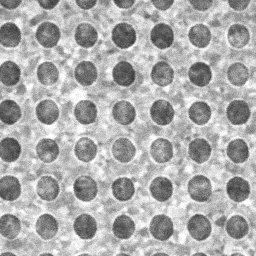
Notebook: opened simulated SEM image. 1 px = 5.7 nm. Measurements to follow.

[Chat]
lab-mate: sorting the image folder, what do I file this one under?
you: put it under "a regular array of holes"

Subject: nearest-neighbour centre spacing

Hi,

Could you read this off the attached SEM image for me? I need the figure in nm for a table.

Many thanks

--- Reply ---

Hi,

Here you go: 215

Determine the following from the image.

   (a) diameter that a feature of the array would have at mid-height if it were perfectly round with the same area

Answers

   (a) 146 nm